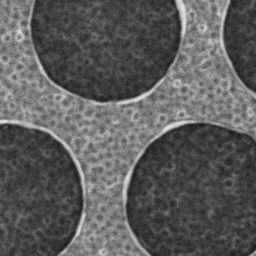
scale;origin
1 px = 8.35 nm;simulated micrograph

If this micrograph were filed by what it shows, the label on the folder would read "holes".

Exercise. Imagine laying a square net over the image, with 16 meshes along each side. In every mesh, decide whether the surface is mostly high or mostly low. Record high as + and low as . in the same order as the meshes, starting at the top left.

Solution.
++.........+++..
++.........+++..
++.........+++..
++.........+++..
+++.......+++++.
++++......+++++.
++++++++++++++++
++++++++++++++++
...+++++++......
....+++++.......
.....+++........
.....+++........
.....+++........
.....+++........
.....+++........
....+++++.......